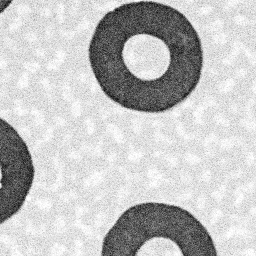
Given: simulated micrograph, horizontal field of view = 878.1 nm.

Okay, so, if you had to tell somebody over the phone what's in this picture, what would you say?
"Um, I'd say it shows ring-shaped grooves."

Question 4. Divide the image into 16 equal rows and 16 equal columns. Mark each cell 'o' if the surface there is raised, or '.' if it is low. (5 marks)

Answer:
ooooooo....ooooo
oooooo......oooo
oooooo..oo...ooo
oooooo..ooo..ooo
oooooo..oo...ooo
oooooo......oooo
ooooooo....ooooo
oooooooooooooooo
.ooooooooooooooo
..oooooooooooooo
..oooooooooooooo
..oooooooooooooo
..oooooooooooooo
.ooooooo....oooo
ooooooo......ooo
oooooo...oo..ooo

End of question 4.